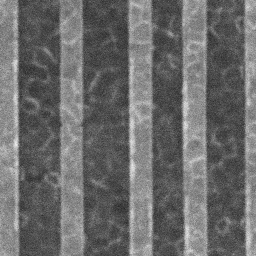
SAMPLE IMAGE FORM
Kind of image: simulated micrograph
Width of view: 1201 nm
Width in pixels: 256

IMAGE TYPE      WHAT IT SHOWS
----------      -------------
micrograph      one or a few lines or trenches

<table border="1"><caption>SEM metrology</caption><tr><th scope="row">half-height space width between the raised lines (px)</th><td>41.7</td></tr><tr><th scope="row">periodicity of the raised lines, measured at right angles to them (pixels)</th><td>61.4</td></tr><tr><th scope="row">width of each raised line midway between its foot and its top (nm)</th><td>99.1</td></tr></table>